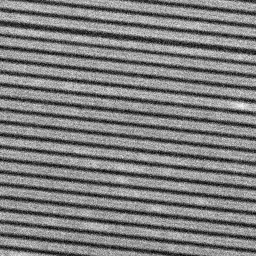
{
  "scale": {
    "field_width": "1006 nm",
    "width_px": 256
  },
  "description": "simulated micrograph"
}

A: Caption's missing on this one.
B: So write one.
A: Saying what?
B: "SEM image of parallel lines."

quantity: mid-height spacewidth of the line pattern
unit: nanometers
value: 22.9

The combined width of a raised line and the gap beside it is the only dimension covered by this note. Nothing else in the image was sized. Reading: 12.4 px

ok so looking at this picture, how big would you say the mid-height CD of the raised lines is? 6.84 px